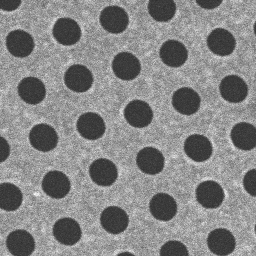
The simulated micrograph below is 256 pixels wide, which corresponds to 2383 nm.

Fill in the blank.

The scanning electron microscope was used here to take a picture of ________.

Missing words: a regular array of holes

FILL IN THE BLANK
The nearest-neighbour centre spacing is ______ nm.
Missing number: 450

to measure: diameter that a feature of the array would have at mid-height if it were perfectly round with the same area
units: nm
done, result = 272